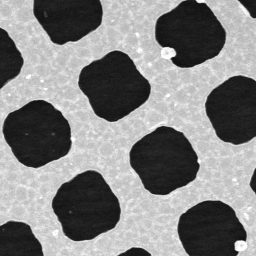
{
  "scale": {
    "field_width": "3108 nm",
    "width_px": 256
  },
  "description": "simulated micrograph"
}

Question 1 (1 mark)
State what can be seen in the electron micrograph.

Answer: holes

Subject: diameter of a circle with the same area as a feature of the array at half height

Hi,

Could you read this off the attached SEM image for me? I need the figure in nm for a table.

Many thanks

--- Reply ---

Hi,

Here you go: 808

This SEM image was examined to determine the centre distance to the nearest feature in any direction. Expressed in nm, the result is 1080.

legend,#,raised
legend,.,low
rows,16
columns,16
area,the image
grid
##....#####..##.
###...####....##
.##..#####....##
.#####..###..###
.####....#######
#####....####...
##.###...####...
....#########...
....#####..###..
#...####....####
########....####
####...##...####
###....#########
####...####....#
..##...####....#
...#####.##....#